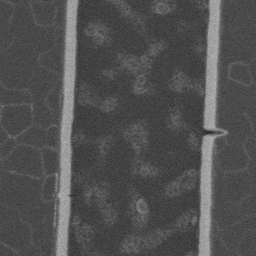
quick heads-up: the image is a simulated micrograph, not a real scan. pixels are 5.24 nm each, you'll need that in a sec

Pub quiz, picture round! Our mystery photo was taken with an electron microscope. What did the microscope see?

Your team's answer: one or a few lines or trenches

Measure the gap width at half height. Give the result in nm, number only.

746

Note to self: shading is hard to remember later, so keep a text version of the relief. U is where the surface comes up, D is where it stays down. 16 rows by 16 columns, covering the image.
UUUUDDDDDDDDDUUU
UUUUDDDDDDDDDUUU
UUUUDDDDDDDDDUUU
UUUUDDDDDDDDDUUU
UUUUDDDDDDDDDUUU
UUUUDDDDDDDDDUUU
UUUUDDDDDDDDDUUU
UUUUDDDDDDDDDUUU
UUUUDDDDDDDDDUUU
UUUUDDDDDDDDDUUU
UUUUDDDDDDDDDUUU
UUUUDDDDDDDDDUUU
UUUUDDDDDDDDDUUU
UUUUDDDDDDDDDUUU
UUUUDDDDDDDDDUUU
UUUUDDDDDDDDDUUU